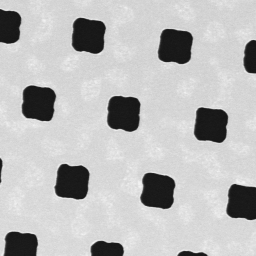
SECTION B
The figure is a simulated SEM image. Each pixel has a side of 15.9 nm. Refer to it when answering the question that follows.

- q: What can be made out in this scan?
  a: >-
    holes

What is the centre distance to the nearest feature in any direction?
1340 nanometres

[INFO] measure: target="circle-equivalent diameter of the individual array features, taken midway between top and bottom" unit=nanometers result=577